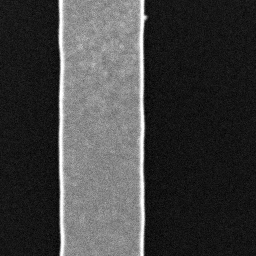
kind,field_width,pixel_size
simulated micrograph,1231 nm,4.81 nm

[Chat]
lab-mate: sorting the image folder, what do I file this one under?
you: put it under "wiring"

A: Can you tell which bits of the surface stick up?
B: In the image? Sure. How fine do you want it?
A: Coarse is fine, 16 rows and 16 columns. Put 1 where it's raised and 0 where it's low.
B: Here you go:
0000111110000000
0000111110000000
0000111110000000
0000111110000000
0000111110000000
0000111110000000
0000111110000000
0000111110000000
0000111110000000
0000111110000000
0000111110000000
0000111110000000
0000111110000000
0000111110000000
0000111110000000
0000111110000000